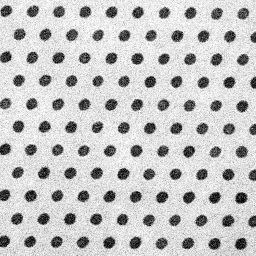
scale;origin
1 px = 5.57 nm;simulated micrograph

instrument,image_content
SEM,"a regular array of holes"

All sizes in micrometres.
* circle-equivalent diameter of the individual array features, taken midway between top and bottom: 0.0706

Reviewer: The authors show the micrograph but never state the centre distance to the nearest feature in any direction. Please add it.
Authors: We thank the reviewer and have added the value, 145 nm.